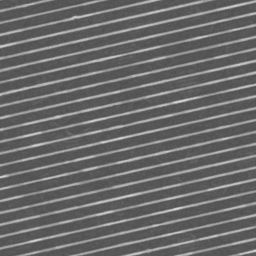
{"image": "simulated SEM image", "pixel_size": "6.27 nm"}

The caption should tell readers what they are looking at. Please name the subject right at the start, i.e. parallel lines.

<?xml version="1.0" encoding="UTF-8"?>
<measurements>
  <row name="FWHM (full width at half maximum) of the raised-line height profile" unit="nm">11.5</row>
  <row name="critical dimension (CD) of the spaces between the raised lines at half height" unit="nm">60.3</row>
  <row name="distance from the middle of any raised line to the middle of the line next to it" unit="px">11.6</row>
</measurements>